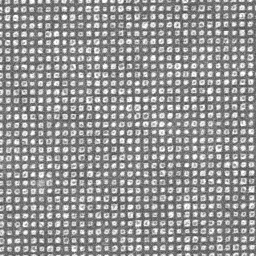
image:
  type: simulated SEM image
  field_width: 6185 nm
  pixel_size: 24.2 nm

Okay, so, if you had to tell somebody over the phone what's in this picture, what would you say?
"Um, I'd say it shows a regular array of raised bodies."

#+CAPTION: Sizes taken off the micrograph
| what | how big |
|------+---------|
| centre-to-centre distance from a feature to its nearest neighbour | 7.86 px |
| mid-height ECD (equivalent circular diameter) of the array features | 106 nm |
